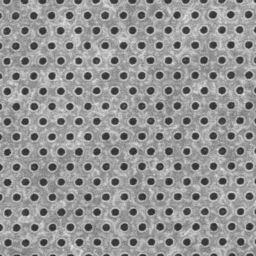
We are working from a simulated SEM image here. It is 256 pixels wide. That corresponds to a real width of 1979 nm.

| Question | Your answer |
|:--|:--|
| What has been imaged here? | a regular array of holes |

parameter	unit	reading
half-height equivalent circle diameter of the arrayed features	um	0.0665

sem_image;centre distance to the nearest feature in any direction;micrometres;0.134